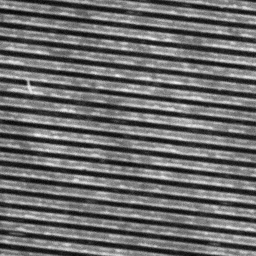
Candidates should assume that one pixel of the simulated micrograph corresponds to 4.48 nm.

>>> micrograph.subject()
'parallel lines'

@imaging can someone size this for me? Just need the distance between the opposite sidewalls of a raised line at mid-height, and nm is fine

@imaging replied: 33.9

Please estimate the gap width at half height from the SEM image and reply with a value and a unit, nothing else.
25.5 nm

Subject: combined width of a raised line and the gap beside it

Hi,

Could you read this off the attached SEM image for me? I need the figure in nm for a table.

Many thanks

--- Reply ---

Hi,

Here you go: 61.5